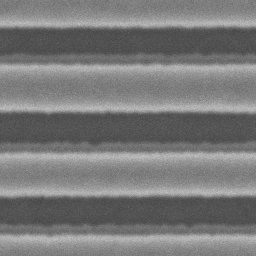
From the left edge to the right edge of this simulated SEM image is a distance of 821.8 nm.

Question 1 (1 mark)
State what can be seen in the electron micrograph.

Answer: lines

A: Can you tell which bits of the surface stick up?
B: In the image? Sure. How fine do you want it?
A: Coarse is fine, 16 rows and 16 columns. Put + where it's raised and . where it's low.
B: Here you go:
++++++++++++++++
++++++++++++++++
................
................
++++++++++++++++
++++++++++++++++
++++++++++++++++
................
................
.+.....+...++...
++++++++++++++++
++++++++++++++++
................
................
................
++++++++++++++++